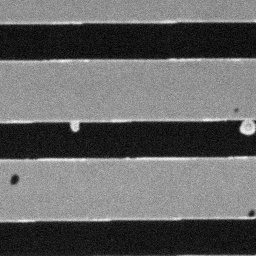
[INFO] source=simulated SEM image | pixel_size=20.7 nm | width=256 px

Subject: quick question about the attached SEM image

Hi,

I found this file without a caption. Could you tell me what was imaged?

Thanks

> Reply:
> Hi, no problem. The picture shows lines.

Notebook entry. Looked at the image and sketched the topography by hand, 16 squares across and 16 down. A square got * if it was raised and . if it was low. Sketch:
****************
................
................
................
****************
****************
****************
***************.
................
................
****************
****************
****************
****************
................
................